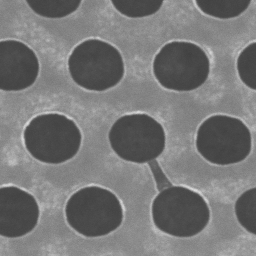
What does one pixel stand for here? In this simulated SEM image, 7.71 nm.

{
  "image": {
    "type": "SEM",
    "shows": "holes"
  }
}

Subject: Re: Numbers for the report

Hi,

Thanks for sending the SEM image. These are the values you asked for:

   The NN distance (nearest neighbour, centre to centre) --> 84.1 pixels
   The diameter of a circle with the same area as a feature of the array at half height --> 0.415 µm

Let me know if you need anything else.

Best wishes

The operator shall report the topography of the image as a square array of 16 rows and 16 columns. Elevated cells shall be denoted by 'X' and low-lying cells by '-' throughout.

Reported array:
XX---XX---XXX--X
XXXXXXXXXXXXXXXX
XXXXXXXXXXXXXXXX
--XX----XX---XX-
--XX----XX---XX-
--XXX--XXX--XXXX
XXXXXXXXXXXXXXXX
XX--XXX---XXX--X
X----XX---XX----
XX---XX---XX----
XXXXXXXXXXXXXXXX
XXXXXXXXXXXXXXXX
--XX---XXX---XX-
--XX----XX---XX-
--XXX--XXX--XXXX
XXXXXXXXXXXXXXXX